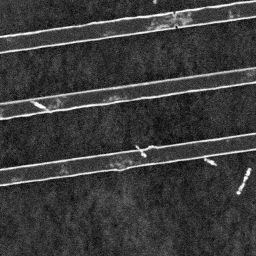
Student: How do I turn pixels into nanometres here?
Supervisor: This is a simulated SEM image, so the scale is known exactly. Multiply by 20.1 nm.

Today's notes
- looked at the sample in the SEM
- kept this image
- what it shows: one or a few lines or trenches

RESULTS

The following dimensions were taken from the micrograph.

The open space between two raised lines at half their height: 1020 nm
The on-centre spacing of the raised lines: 1320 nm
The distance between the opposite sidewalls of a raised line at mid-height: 311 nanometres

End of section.